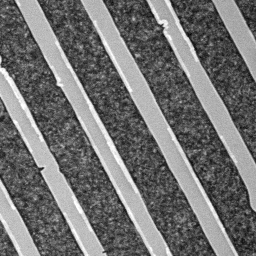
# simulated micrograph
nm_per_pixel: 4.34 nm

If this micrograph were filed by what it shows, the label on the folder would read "parallel lines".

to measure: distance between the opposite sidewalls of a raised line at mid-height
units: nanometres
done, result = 79.1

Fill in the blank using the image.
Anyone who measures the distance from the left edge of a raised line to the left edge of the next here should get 252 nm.